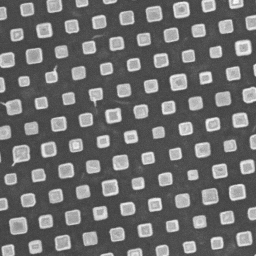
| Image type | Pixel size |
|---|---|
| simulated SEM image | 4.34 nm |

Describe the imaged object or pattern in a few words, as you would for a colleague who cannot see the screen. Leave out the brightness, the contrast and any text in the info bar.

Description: a regular array of raised bodies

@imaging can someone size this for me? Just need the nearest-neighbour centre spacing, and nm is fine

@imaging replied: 118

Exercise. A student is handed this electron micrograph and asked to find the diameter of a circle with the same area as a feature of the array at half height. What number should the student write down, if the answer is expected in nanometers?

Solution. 62.8